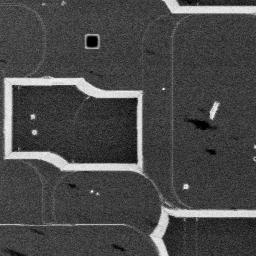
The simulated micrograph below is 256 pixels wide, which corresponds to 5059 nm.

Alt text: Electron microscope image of wiring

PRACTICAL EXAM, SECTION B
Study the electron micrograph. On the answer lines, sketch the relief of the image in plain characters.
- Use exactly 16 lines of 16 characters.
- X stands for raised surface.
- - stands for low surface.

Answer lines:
XXXXXXXXXXX-----
XXXXXXXXXXXXXXXX
XXXXXXXXXXXXXXXX
XXXXXXXXXXXXXXXX
XXXXXXXXXXXXXXXX
X----XXXXXXXXXXX
---------XXXXXXX
---------XXXXXXX
---------XXXXXXX
X--------XXXXXXX
XXXXXXXXXXXXXXXX
XXXXXXXXXXXXXXXX
XXXXXXXXXXXXXXXX
XXXXXXXXXX------
XXXXXXXXXX------
XXXXXXXXXX------